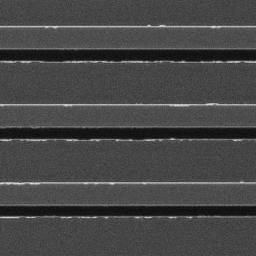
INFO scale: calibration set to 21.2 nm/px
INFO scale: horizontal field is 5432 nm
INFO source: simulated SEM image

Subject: lines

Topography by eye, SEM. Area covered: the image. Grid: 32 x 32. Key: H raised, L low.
LLLLLLLLLLLLLLLLLLLLLLLLLLLLLLLL
LLLLLLLLLLLLLLLLLLLLLLLLLLLLLLLL
LLLLLLLLLLLLLLLLLLLLLLLLLLLLLLLL
HHHHHHHHHHHHHHHHHHHHHHHHHHHHHHHH
HHHHHHHHHHHHHHHHHHHHHHHHHHHHHHHH
HHHHHHHHHHHHHHHHHHHHHHHHHHHHHHHH
HHHHHHHHHHHHHHHHHHHHHHHHHHHHHHHH
HHHHHHHHHHHHHHHHHHHHHHHHHHHHHHHH
LLLLLLLLLLLLLLLLLLLLLLLLLLLLLLLL
LLLLLLLLLLLLLLLLLLLLLLLLLLLLLLLL
LLLLLLLLLLLLLLLLLLLLLLLLLLLLLLLL
LLLLLLLLLLLLLLLLLLLLLLLLLLLLLLLL
LLLLLLLLLLLLLLLLLLLLLLLLLLLLLLLL
HHHHHHHHHHHHHHHHHHHHHHHHHHHHHHHH
HHHHHHHHHHHHHHHHHHHHHHHHHHHHHHHH
HHHHHHHHHHHHHHHHHHHHHHHHHHHHHHHH
HHHHHHHHHHHHHHHHHHHHHHHHHHHHHHHH
HHLLHLLLHHHHHLLHHHHLLLLLLLLLLLLL
LLLLLLLLLLLLLLLLLLLLLLLLLLLLLLLL
LLLLLLLLLLLLLLLLLLLLLLLLLLLLLLLL
LLLLLLLLLLLLLLLLLLLLLLLLLLLLLLLL
LLLLLLLLLLLLLLLLLLLLLLLLLLLLLLLL
LLLLLLLLLLLLLLLLLLLLLLLLLLLLLLLL
HHHHHHHHHHHHHHHHHHHHHHHHHHHHHHHH
HHHHHHHHHHHHHHHHHHHHHHHHHHHHHHHH
HHHHHHHHHHHHHHHHHHHHHHHHHHHHHHHH
HHHHHHHHHHHHHHHHHHHHHHHHHHHHHHHH
LLLLLLLLLLLLLLLLLLLLLLLLLLLLLLLL
LLLLLLLLLLLLLLLLLLLLLLLLLLLLLLLL
LLLLLLLLLLLLLLLLLLLLLLLLLLLLLLLL
LLLLLLLLLLLLLLLLLLLLLLLLLLLLLLLL
LLLLLLLLLLLLLLLLLLLLLLLLLLLLLLLL